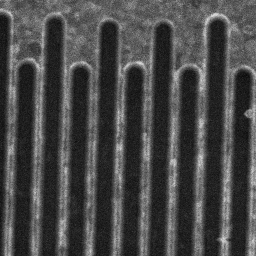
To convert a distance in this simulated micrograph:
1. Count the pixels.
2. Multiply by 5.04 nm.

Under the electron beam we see parallel lines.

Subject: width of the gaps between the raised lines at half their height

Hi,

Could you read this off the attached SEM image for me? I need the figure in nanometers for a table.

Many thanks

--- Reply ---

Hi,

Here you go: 85.7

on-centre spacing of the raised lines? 137 nanometres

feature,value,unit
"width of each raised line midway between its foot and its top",0.0517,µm